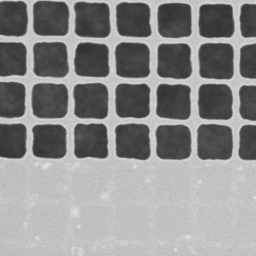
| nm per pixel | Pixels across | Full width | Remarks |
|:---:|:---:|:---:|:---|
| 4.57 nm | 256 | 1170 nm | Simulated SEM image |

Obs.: a regular array of holes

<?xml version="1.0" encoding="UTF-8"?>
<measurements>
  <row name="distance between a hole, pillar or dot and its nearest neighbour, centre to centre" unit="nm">184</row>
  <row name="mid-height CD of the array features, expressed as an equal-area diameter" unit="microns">0.174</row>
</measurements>